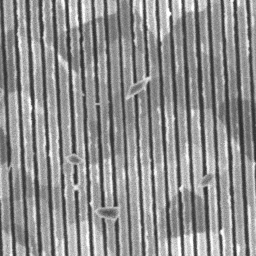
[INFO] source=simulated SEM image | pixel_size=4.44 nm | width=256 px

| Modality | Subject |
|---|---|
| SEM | parallel lines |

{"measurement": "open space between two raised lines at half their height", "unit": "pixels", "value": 4.75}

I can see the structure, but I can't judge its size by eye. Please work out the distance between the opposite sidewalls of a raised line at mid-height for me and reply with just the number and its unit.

37.7 nanometers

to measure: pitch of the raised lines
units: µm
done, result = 0.0575